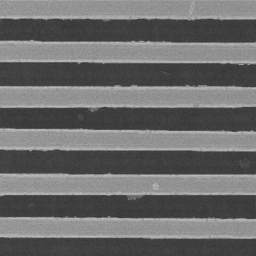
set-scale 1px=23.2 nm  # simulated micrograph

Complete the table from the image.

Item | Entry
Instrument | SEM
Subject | lines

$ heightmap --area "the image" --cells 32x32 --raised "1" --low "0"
11111111111111111111111111111111
11111111111111111111111111111111
00000000000000000000000000000000
00000000000000000000000000000000
00000000000000000000000000000000
11111111111111111111111111111111
11111111111111111111111111111111
11111111111111111111111111111111
00000000000000000000000000000000
00000000000000000000000000000000
00000000000000000000000000000000
11111111111111111111111111111111
11111111111111111111111111111111
00000000000000000000000000000000
00000000000000000000000000000000
00000000000000000000000000000000
11111111111111111111111111111010
11111111111111111111111111111111
11111111111111111111111111111111
00000000000000000000000000000000
00000000000000000000000000000000
00000000000000000000000000000000
11111111111111111111111111111111
11111111111111111111111111111111
00000000000000000000000000000000
00000000000000000000000000000000
00000000000000000000000000000000
11111111111111111111111111111111
11111111111111111111111111111111
11111111111111111111111111111111
00000000000000000000000000000000
00000000000000000000000000000000